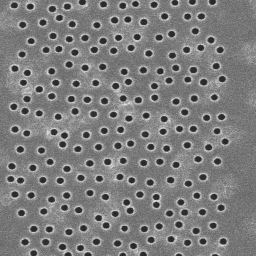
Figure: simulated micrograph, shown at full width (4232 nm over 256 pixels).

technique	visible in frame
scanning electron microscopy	a regular array of holes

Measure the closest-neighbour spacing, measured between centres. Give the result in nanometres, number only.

233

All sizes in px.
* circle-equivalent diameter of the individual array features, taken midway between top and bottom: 6.96